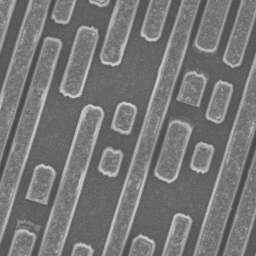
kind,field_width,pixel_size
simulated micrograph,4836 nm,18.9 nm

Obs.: parallel lines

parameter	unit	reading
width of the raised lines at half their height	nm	354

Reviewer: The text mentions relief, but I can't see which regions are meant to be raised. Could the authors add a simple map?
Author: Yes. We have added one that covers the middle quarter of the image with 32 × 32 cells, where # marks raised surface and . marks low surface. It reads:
.#####..................#####...
######..................#####...
######..................#####..#
#####...................####..##
#####..................#####..##
#####..................####..###
####...................####..###
####..................#####..###
......................####..####
......................####....##
......#.......###....#####......
.....####....#####...####.......
.....#####...#####...####.......
....#####....####...#####.......
....#####...#####...#####..##...
....#####...#####...####..#####.
...######....####..#####..######
...#####...........#####..#####.
...#####...........####..######.
..######...........####..######.
..#####...........#####..#####..
..#####....#......####...#####..
.######...####....####..######..
.######...####...#####..#####...
.#####...#####...####...#####...
.#####...#####...####..######...
######...#####..#####..######...
#####......##...#####..#####....
#####...........####....####....
#####..........#####............
####...........#####............
####...........####.............